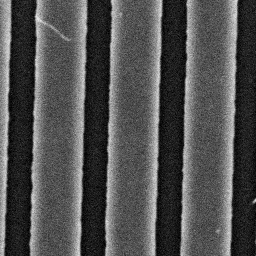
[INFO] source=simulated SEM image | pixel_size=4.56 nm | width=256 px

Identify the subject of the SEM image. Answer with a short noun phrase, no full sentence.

lines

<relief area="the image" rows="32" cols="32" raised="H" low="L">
HLLLLHHHHHHLLLHHHHHHLLLHHHHHHHLL
HLLLLHHHHHHLLLHHHHHHLLLHHHHHHHLL
HLLLHHHHHHHLLLHHHHHHLLLHHHHHHLLL
HLLLLHHHHHHLLLHHHHHHLLLHHHHHHHLL
HLLLLHHHHHHLLLHHHHHHLLLHHHHHHHLL
HLLLLHHHHHHLLLHHHHHHLLLHHHHHHLLL
HLLLLHHHHHHLLLHHHHHHLLLHHHHHHLLL
HLLLHHHHHHHLLLHHHHHHLLLHHHHHHLLL
HLLLHHHHHHHLLLHHHHHHLLLHHHHHHLLL
HLLLHHHHHHHLLLHHHHHHLLLHHHHHHLLL
HLLLHHHHHHHLLLHHHHHHLLLHHHHHHLLL
HLLLHHHHHHLLLLHHHHHHLLLHHHHHHLLL
HLLLHHHHHHLLLLHHHHHHLLLHHHHHHLLL
HLLLHHHHHHLLLLHHHHHHLLLHHHHHHLLL
HLLLHHHHHHLLLLHHHHHHLLLHHHHHHLLL
HLLLHHHHHHLLLLHHHHHHLLLHHHHHHLLL
HLLLHHHHHHLLLLHHHHHHLLLHHHHHHLLL
HLLLHHHHHHLLLLHHHHHHLLLHHHHHHLLL
HLLLHHHHHHLLLHHHHHHHLLLHHHHHHLLL
HLLLHHHHHHLLLLHHHHHHLLLHHHHHHLLL
HLLLHHHHHHLLLHHHHHHHLLLHHHHHHLLL
HLLLHHHHHHLLLHHHHHHHLLLHHHHHHLLL
HLLLHHHHHHLLLHHHHHHHLLLHHHHHHLLL
HLLLHHHHHHLLLHHHHHHHLLLHHHHHHLLL
HLLLHHHHHHLLLHHHHHHLLLLHHHHHHLLL
HLLLHHHHHHLLLHHHHHHLLLLHHHHHHLLL
HLLLHHHHHHLLLHHHHHHLLLLHHHHHHLLL
HLLLHHHHHHLLLHHHHHHLLLLHHHHHHLLL
HLLLHHHHHHLLLHHHHHHLLLLHHHHHHLLL
HLLLHHHHHHLLLHHHHHHLLLLHHHHHHLLL
LLLLHHHHHHLLLHHHHHHLLLLHHHHHHLLL
LLLLHHHHHHLLLHHHHHHLLLLHHHHHHLLL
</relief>